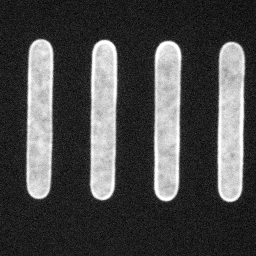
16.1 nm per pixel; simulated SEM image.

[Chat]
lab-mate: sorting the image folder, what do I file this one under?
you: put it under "groups of lines, slits or small figures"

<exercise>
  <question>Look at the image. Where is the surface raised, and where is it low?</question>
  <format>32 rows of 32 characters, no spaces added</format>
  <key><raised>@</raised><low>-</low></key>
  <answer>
--------------------------------
--------------------------------
--------------------------------
--------------------------------
--------------------------------
----@@------@@-------@------@@--
----@@------@@------@@------@@--
----@@------@@------@@------@@--
----@@------@@-----@@@------@@--
----@@------@@-----@@@------@@--
----@@------@@-----@@@------@@--
----@@------@@-----@@@------@@--
----@@------@@-----@@@------@@--
----@@------@@-----@@@------@@--
----@@------@@-----@@@------@@--
----@@------@@-----@@@------@@--
----@@------@@-----@@@-----@@@--
---@@@------@@-----@@@-----@@@--
---@@@------@@-----@@@-----@@@--
---@@@------@@------@@-----@@@--
---@@@------@@------@@-----@@@--
---@@@-----@@@------@@-----@@@--
---@@@-----@@@-----@@@-----@@@--
---@@@-----@@@-----@@@-----@@@--
----@@------@@------@@------@@--
--------------------------------
--------------------------------
--------------------------------
--------------------------------
--------------------------------
--------------------------------
--------------------------------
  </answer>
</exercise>